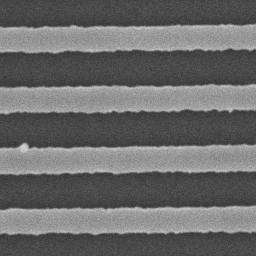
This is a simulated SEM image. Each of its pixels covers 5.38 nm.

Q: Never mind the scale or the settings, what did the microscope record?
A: lines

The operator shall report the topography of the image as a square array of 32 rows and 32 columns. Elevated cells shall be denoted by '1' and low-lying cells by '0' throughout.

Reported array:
00000000000000000000000000000000
00000000000000000000000000000000
00000000000000000000000000000000
11110111111111111111111111111111
11111111111111111111111111111111
11111111111111111111111111111111
00011011000000000000000000000000
00000000000000000000000000000000
00000000000000000000000000000000
00000000000000000000000000000000
00000000000000000000000000000000
11111111111111111111111111111111
11111111111111111111111111111111
11111111111111111111111111111111
00000000000000000000000000000000
00000000000000000000000000000000
00000000000000000000000000000000
00000000000000000000000000000000
00110000001011001111111111111111
11111111111111111111111111111111
11111111111111111111111111111111
11111111111100110100000100000000
00000000000000000000000000000000
00000000000000000000000000000000
00000000000000000000000000000000
00000000000000000000000000000000
11111111111111111111111111111111
11111111111111111111111111111111
11111111111111111111111111111111
00000000000000000000000000000000
00000000000000000000000000000000
00000000000000000000000000000000